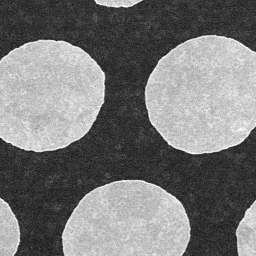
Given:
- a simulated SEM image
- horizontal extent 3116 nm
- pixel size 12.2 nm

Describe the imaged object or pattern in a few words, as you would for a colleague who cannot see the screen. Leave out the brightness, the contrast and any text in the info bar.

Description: raised bodies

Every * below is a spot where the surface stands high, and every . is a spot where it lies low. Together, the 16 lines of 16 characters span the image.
................
................
............***.
******....******
******....******
******...*******
******...*******
******...*******
*****.....*****.
............*...
................
.......**.......
.....******.....
*...********...*
*...********...*
*...********...*